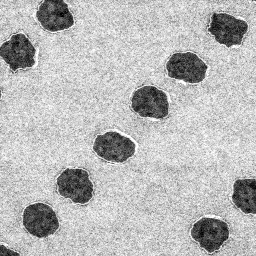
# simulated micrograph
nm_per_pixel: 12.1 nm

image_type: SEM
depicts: raised bodies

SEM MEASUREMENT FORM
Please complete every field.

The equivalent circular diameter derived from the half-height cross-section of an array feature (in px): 36.8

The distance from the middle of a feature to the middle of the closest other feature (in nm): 608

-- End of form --